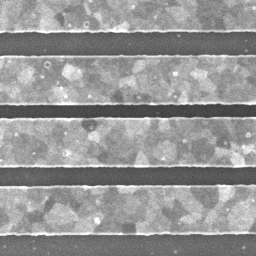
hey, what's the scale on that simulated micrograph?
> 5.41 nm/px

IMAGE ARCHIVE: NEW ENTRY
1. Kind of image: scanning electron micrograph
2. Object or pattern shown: lines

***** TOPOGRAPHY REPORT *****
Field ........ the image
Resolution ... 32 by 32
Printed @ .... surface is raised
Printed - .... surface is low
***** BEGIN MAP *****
@@@@@@@@@@@@@@@@@@@@@@@@@@@@@@@@
@@@@@@@@@@@@@@@@@@@@@@@@@@@@@@@@
@@@@@@@@@@@@@@@@@@@@@@@@@@@@@@@@
@@@@@@@@@@@@@@@@@@@@@@@@@@@@@@@@
--------------------------------
--------------------------------
--------------------------------
@@@@@@@@@@@@@@@@@@@@@@@@@@@@@@@@
@@@@@@@@@@@@@@@@@@@@@@@@@@@@@@@@
@@@@@@@@@@@@@@@@@@@@@@@@@@@@@@@@
@@@@@@@@@@@@@@@@@@@@@@@@@@@@@@@@
@@@@@@@@@@@@@@@@@@@@@@@@@@@@@@@@
@@@@@@@@@@@@@@@@@@@@@@@@@@@@@@@@
--------------------------------
--------------------------------
@@@@@@@@@@@@@@@@@@@@@@@@@@@@@@@@
@@@@@@@@@@@@@@@@@@@@@@@@@@@@@@@@
@@@@@@@@@@@@@@@@@@@@@@@@@@@@@@@@
@@@@@@@@@@@@@@@@@@@@@@@@@@@@@@@@
@@@@@@@@@@@@@@@@@@@@@@@@@@@@@@@@
@@@@@@@@@@@@@@@@@@@@@@@@@@@@@@@@
--------------------------------
--------------------------------
@@@@@@@@@@@@@@@@@@@@@@@@@@@@@@@@
@@@@@@@@@@@@@@@@@@@@@@@@@@@@@@@@
@@@@@@@@@@@@@@@@@@@@@@@@@@@@@@@@
@@@@@@@@@@@@@@@@@@@@@@@@@@@@@@@@
@@@@@@@@@@@@@@@@@@@@@@@@@@@@@@@@
@@@@@@@@@@@@@@@@@@@@@@@@@@@@@@@@
--------------------------------
--------------------------------
--------------------------------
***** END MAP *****